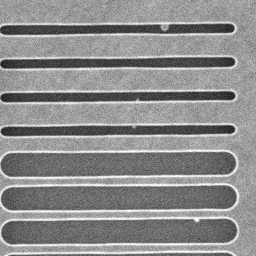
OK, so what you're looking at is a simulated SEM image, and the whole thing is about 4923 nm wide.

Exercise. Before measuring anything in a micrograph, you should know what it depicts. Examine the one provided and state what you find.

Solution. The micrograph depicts groups of lines, slits or small figures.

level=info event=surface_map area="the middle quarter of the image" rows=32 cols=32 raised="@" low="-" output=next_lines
--------------------------------
@@@@@@@@@@@@@@@@@@@@@@@@@@@@@@@@
@@@@@@@@@@@@@@@@@@@@@@@@@@@@@@@@
@@@@@@@@@@@@@@@@@@@@@@@@@@@@@@@@
@@@@@@@@@@@@@@@@@@@@@@@@@@@@@@@@
@@@@@@@@@@@@@@@@@@@@@@@@@@@@@@@@
@@@@@@@@@@@@@@@@@@@@@@@@@@@@@@@@
--------------------------------
--------------------------------
------------------------@@@@@@@@
@@@@@@@@@@@@@@@@@@@@@@@@@@@@@@@@
@@@@@@@@@@@@@@@@@@@@@@@@@@@@@@@@
@@@@@@@@@@@@@@@@@@@@@@@@@@@@@@@@
@@@@@@@@@@@@@@@@@@@@@@@@@@@@@@@@
@@@@@@@@@@@@@@@@@@@@@@@@@@@@@@@@
--------------------------------
--------------------------------
--------------------------------
@@@@@@@@@@@@@@@@@@@@@@@@@@@@@@@@
@@@@@@@@@@@@@@@@@@@@@@@@@@@@@@@@
@@@@@@@@@@@@@@@@@@@@@@@@@@@@@@@@
@@@@@@@@@@@@@@@@@@@@@@@@@@@@@@@@
--------------------------------
--------------------------------
--------------------------------
--------------------------------
--------------------------------
--------------------------------
@@@@@@@@@@@@@@@@@@@@@@@@@@@@@@@@
@@@@@@@@@@@@@@@@@@@@@@@@@@@@@@@@
--------------------------------
--------------------------------